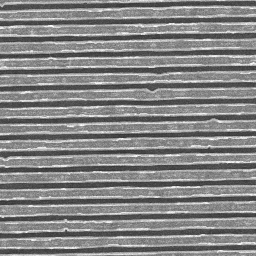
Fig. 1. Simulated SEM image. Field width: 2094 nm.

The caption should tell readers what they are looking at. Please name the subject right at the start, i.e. parallel lines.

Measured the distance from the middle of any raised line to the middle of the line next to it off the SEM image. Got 0.133 microns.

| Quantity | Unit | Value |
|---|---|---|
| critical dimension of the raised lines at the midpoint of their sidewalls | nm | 86.9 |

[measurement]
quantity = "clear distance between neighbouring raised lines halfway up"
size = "48.1 nanometres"